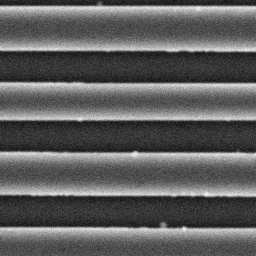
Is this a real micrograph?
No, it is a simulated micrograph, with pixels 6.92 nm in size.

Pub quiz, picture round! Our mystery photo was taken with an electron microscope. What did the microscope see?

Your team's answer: lines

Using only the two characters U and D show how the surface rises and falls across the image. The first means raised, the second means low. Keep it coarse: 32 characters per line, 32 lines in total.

DDDDDDDDDDDDDDDDDDDDDDDDDDDDDDDD
UUUUUUUUUUUUUUUUUUUUUUUUUUUUUUUU
UUUUUUUUUUUUUUUUUUUUUUUUUUUUUUUU
UUUUUUUUUUUUUUUUUUUUUUUUUUUUUUUU
UUUUUUUUUUUUUUUUUUUUUUUUUUUUUUUU
UUUUUUUUUUUUUUUUUUUUUUUUUUUUUUUU
DDDDDDDDDDDDDDDDDDDDDDDDDDDDDDDD
DDDDDDDDDDDDDDDDDDDDDDDDDDDDDDDD
DDDDDDDDDDDDDDDDDDDDDDDDDDDDDDDD
DDDDDDDDDDDDDDDDDDDDDDDDDDDDDDDD
UUUUUUUUUUUDDDDDDDDDDDDDDDDDDDDD
UUUUUUUUUUUUUUUUUUUUUUUUUUUUUUUU
UUUUUUUUUUUUUUUUUUUUUUUUUUUUUUUU
UUUUUUUUUUUUUUUUUUUUUUUUUUUUUUUU
UUUUUUUUUUUUUUUUUUUUUUUUUUUUUUUU
DDDDDDDDDDDDDDDDDDDDDDDDDDDDDDDD
DDDDDDDDDDDDDDDDDDDDDDDDDDDDDDDD
DDDDDDDDDDDDDDDDDDDDDDDDDDDDDDDD
DDDDDDDDDDDDDDDDDDDDDDDDDDDDDDDD
UUUUUUUUUUUUUUUUUUUUUUUUUUUUUUUU
UUUUUUUUUUUUUUUUUUUUUUUUUUUUUUUU
UUUUUUUUUUUUUUUUUUUUUUUUUUUUUUUU
UUUUUUUUUUUUUUUUUUUUUUUUUUUUUUUU
UUUUUUUUUUUUUUUUUUUUUUUUUUUUUUUU
DDDDDDDDDDDDDDDDDDDDDDDDDDDDDDDD
DDDDDDDDDDDDDDDDDDDDDDDDDDDDDDDD
DDDDDDDDDDDDDDDDDDDDDDDDDDDDDDDD
DDDDDDDDDDDDDDDDDDDDDDDDDDDDDDDD
DDDDDDDDDDDDDDDDDDDDDDUUDDDDDDDD
UUUUUUUUUUUUUUUUUUUUUUUUUUUUUUUU
UUUUUUUUUUUUUUUUUUUUUUUUUUUUUUUU
UUUUUUUUUUUUUUUUUUUUUUUUUUUUUUUU